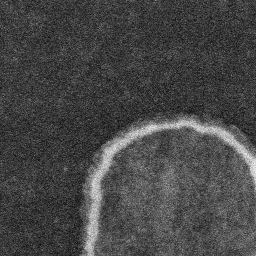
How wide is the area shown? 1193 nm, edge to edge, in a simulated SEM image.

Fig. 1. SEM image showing one or a few lines or trenches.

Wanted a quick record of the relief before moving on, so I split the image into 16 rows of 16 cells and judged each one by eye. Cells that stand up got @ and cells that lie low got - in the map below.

----------------
----------------
----------------
----------------
----------------
----------------
----------------
----------------
--------@@@@@@--
-------@@@@@@@@-
------@@@@@@@@@@
------@@@@@@@@@@
------@@@@@@@@@@
------@@@@@@@@@@
------@@@@@@@@@@
------@@@@@@@@@@